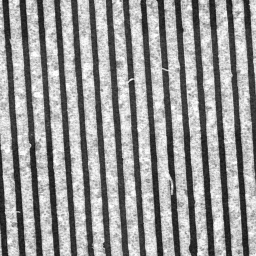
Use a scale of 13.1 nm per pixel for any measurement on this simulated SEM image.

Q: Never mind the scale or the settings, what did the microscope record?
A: parallel lines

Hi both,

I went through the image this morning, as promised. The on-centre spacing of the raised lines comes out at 225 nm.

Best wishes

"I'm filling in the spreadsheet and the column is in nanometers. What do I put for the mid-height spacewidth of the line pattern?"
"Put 86.5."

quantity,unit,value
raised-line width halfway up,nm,139